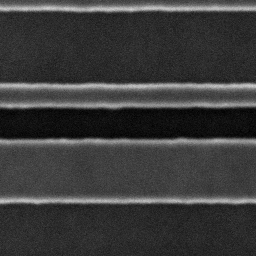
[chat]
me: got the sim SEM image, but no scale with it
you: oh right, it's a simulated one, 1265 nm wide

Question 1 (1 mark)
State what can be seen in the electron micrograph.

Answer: lines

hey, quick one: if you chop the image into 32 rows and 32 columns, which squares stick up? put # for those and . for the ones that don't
################################
................................
................................
................................
................................
................................
................................
................................
................................
................................
................................
################################
################################
................................
................................
................................
................................
................................
################################
################################
################################
################################
################################
################################
################################
................................
................................
................................
................................
................................
................................
................................